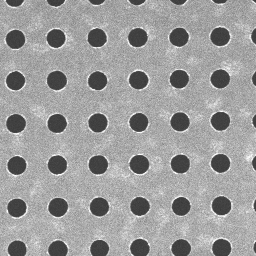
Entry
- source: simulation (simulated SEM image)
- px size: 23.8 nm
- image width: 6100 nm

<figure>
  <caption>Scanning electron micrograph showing a regular array of holes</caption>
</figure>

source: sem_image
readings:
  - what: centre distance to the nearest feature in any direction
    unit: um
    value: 0.967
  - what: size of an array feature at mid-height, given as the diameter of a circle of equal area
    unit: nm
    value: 463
